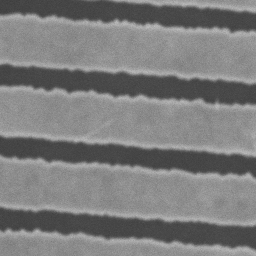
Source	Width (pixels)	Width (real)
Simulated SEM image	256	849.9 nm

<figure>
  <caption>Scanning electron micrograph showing lines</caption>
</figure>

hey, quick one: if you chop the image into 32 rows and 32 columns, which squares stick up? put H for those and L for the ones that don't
LLLLLLLLLLLLLLLLLLLHHHHHHHHHHHHH
LLLLLLLLLLLLLLLLLLLLLLLLLLLLLLLH
HHHHHHHHHLLLLLLLLLLLLLLLLLLLLLLL
HHHHHHHHHHHHHHHHHHHHHHHLLLLLLLLL
HHHHHHHHHHHHHHHHHHHHHHHHHHHHHHHH
HHHHHHHHHHHHHHHHHHHHHHHHHHHHHHHH
HHHHHHHHHHHHHHHHHHHHHHHHHHHHHHHH
HHHHHHHHHHHHHHHHHHHHHHHHHHHHHHHH
LLLLLLHHHHHHHHHHHHHHHHHHHHHHHHHH
LLLLLLLLLLLLLLLLLLLLHLHHHHHHHHHH
LLLLLLLLLLLLLLLLLLLLLLLLLLLLLLLH
HHHHHHHHLHLHLLLLLLLLLLLLLLLLLLLL
HHHHHHHHHHHHHHHHHHHHHHHLLLLLLLLL
HHHHHHHHHHHHHHHHHHHHHHHHHHHHHHHH
HHHHHHHHHHHHHHHHHHHHHHHHHHHHHHHH
HHHHHHHHHHHHHHHHHHHHHHHHHHHHHHHH
HHHHHHHHHHHHHHHHHHHHHHHHHHHHHHHH
LLLLLLHHHHHHHHHHHHHHHHHHHHHHHHHH
LLLLLLLLLLLLLLLLLLHLHHHHHHHHHHHH
LLLLLLLLLLLLLLLLLLLLLLLLLLLLLLLH
HHHHHHHHHHHHHLLLLLLLLLLLLLLLLLLL
HHHHHHHHHHHHHHHHHHHHHHHLLLLLLLLL
HHHHHHHHHHHHHHHHHHHHHHHHHHHHHHHH
HHHHHHHHHHHHHHHHHHHHHHHHHHHHHHHH
HHHHHHHHHHHHHHHHHHHHHHHHHHHHHHHH
HHHHHHHHHHHHHHHHHHHHHHHHHHHHHHHH
LLLLLLLLHHHHHHHHHHHHHHHHHHHHHHHH
LLLLLLLLLLLLLLLLLLLLHHHHHHHHHHHH
LLLLLLLLLLLLLLLLLLLLLLLLLLLLLLLL
HHHHHHHHHHHLLLLLLLLLLLLLLLLLLLLL
HHHHHHHHHHHHHHHHHHHHHHHLLLLLLLLL
HHHHHHHHHHHHHHHHHHHHHHHHHHHHHHHH